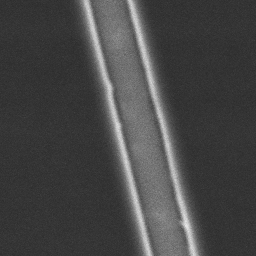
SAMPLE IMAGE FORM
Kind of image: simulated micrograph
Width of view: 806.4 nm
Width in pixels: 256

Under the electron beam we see one or a few lines or trenches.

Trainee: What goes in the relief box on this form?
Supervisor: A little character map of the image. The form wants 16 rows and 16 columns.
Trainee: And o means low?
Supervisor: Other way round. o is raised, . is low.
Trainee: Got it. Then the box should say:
oooooo..oooooooo
oooooo..oooooooo
oooooo...ooooooo
oooooo...ooooooo
ooooooo..ooooooo
ooooooo..ooooooo
ooooooo...oooooo
ooooooo...oooooo
oooooooo..oooooo
oooooooo...ooooo
oooooooo...ooooo
oooooooo...ooooo
ooooooooo..ooooo
ooooooooo..ooooo
ooooooooo...oooo
ooooooooo...oooo